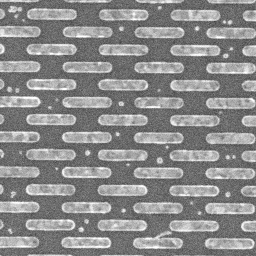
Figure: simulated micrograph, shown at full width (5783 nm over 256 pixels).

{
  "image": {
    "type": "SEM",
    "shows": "groups of lines, slits or small figures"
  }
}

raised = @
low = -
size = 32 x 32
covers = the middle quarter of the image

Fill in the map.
@@@@@@@@@@@@------@@@@@@@@@@@@--
@@@@@@@@@@@-------@@@@@@@@@@@@--
--------------------------------
--------------------------------
@@@------@@@@@@@@@@@-------@@@@@
@@@------@@@@@@@@@@@@------@@@@@
--------------------------------
--------------------------------
@@@@@@@@@@@---------------------
@@@@@@@@@@@@------@@@@@@@@@@@@--
@@@@@@@@@@@-------@@@@@@@@@@@@--
--------------------------------
--------------------------------
@@@------@@@@@@@@@@@@------@@@@@
@@@------@@@@@@@@@@@@------@@@@@
--------------------------------
--------------------------------
@@@@@@@@@@@-------@@@@@@@@@@@---
@@@@@@@@@@@@------@@@@@@@@@@@@--
------------------@@@@@@@@@@@---
--------------------------------
--------------------------------
@@@------@@@@@@@@@@@@------@@@@@
@@-------@@@@@@@@@@@-------@@@@@
--------------------------------
--------------------------------
@@@@@@@@@@@-------@@@@@@@@@@@---
@@@@@@@@@@@@------@@@@@@@@@@@@--
--------------------------------
--------------------------------
@@-------@@@@@@@@@--------------
@@@------@@@@@@@@@@@@------@@@@@